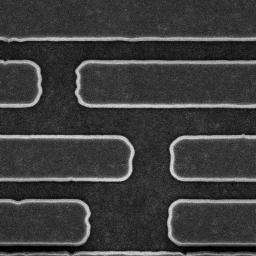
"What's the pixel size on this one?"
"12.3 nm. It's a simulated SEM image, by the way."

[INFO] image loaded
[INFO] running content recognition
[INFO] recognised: one or a few lines or trenches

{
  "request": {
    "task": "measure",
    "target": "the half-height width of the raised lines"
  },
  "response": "537 nm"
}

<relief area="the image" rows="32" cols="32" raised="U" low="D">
UUUUUUUUUUUUUUUUUUUUUUUUUUUUUUUU
UUUUUUUUUUUUUUUUUUUUUUUUUUUUUUUU
UUUUUUUUUUUUUUUUUUUUUUUUUUUUUUUU
UUUUUUUUUUUUUUUUUUUUUUUUUUUUUUUU
UUUUUUUUUUUUUUUUUUUUUUUUUUUUUUUU
DDDDDDDDDDDDDDDDDDDDDDDDDDDDDDDD
DDDDDDDDDDDDDDDDDDDDDDDDDDDDDDDD
DDDDDDDDDDDDDDDDDDDDDDDDDDDDDDDD
UUUUUDDDDDUUUUUUUUUUUUUUUUUUUUUU
UUUUUDDDDDUUUUUUUUUUUUUUUUUUUUUU
UUUUUDDDDDUUUUUUUUUUUUUUUUUUUUUU
UUUUUDDDDDUUUUUUUUUUUUUUUUUUUUUU
UUUUUDDDDDUUUUUUUUUUUUUUUUUUUUUU
DDDDDDDDDDDDDDDDDDDDDDDDDDDDDDDD
DDDDDDDDDDDDDDDDDDDDDDDDDDDDDDDD
DDDDDDDDDDDDDDDDDDDDDDDDDDDDDDDD
DDDDDDDDDDDDDDDDDDDDDDDDDDDDDDDD
UUUUUUUUUUUUUUUUDDDDDDUUUUUUUUUU
UUUUUUUUUUUUUUUUUDDDDUUUUUUUUUUU
UUUUUUUUUUUUUUUUUDDDDDUUUUUUUUUU
UUUUUUUUUUUUUUUUDDDDDDUUUUUUUUUU
UUUUUUUUUUUUUUUUDDDDDDUUUUUUUUUU
DDDDDDDDDDDDDDDDDDDDDDDUDUUUUUUU
DDDDDDDDDDDDDDDDDDDDDDDDDDDDDDDD
DDDDDDDDDDDDDDDDDDDDDDDDDDDDDDDD
UUUUUUUUUUDDDDDDDDDDDDUUUUUUUUUU
UUUUUUUUUUUDDDDDDDDDDUUUUUUUUUUU
UUUUUUUUUUUDDDDDDDDDDUUUUUUUUUUU
UUUUUUUUUUUDDDDDDDDDDUUUUUUUUUUU
UUUUUUUUUUUDDDDDDDDDDUUUUUUUUUUU
DDDUUUUUUUDDDDDDDDDDDDUUUUUUUUUU
DDDDDDDDDDDDDDDDDDDDDDDDDDDDDDDD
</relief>